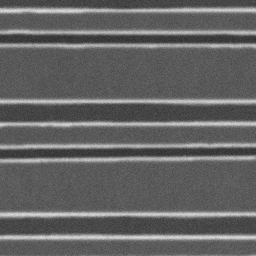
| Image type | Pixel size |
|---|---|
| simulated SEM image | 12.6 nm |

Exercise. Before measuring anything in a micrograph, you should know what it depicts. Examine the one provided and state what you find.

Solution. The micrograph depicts lines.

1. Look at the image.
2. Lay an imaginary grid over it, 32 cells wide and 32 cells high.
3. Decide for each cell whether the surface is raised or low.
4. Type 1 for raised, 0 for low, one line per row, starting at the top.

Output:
00000000000000000000000000000000
11111111111111111111111111111111
11111111111111111111111111111111
11111111111111111111111111111111
00000000000000000000000000000000
00000000000000000000000000000000
11111111111111111111111111111111
11111111111111111111111111111111
11111111111111111111111111111111
11111111111111111111111111111111
11111111111111111111111111111111
11111111111111111111111111111111
11111111111111111111111111111111
00000000000000000000000000000000
00000000000000000000000000000000
00000000000000000000000000011100
11111111111111111111111111111111
11111111111111111111111111111111
00000000000000000000000000000000
00000000000000000000000000000000
11111111111111111111111111111111
11111111111111111111111111111111
11111111111111111111111111111111
11111111111111111111111111111111
11111111111111111111111111111111
11111111111111111111111111111111
11111111111111111111111111111111
00000000000000000000000000000000
00000000000000000000000000000000
00000000000000000000000000000000
11111111111111111111111111111111
11111111111111111111111111111111